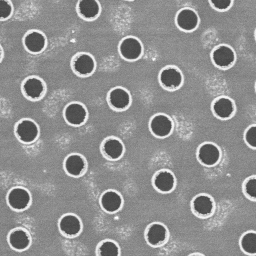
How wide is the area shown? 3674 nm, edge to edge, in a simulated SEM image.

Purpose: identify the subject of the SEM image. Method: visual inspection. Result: a regular array of raised bodies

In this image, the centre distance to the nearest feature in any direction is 676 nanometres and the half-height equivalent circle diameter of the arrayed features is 0.339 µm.